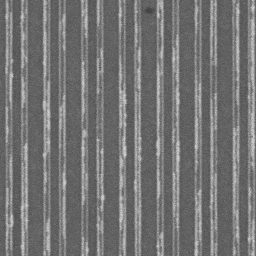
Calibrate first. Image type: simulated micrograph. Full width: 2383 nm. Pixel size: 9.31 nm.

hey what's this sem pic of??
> parallel lines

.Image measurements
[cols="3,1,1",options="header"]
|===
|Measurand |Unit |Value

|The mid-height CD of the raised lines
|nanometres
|50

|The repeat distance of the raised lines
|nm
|174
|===